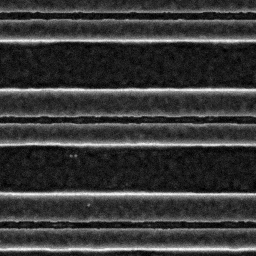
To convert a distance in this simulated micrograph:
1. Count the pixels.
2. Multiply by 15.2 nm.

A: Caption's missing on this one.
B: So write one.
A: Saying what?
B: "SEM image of lines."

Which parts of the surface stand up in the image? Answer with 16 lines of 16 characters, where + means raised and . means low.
++++++++++++++++
++++++++++++++++
++++...++++.++++
................
................
................
++++++++++++++++
++++++++++++++++
++++++++++++++++
................
................
................
++++++++++++++++
++++++++++++++++
++++++++++++++++
++++++++++++++++